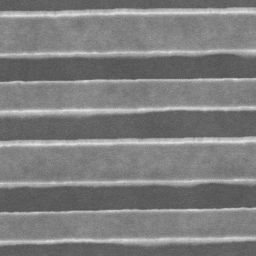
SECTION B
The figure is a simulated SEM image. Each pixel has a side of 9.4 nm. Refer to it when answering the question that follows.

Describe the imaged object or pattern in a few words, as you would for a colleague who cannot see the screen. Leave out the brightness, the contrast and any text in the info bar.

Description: lines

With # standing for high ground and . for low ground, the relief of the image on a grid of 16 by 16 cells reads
................
################
################
................
................
################
################
................
................
################
################
##..............
................
################
################
................